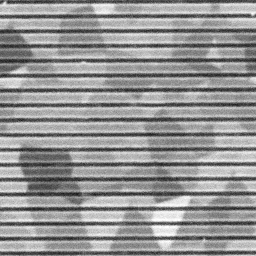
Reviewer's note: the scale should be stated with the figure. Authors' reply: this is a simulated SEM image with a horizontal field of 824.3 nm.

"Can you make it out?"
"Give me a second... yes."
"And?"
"parallel lines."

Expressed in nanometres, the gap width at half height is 16.9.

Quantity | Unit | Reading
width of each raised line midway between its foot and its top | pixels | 9.5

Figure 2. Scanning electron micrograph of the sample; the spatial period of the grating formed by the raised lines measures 47.6 nm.